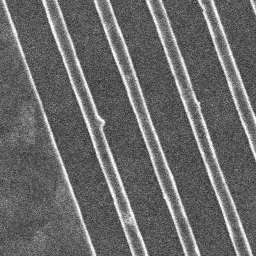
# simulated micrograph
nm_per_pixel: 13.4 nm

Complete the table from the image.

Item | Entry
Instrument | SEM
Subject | parallel lines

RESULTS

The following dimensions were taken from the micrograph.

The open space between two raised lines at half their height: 482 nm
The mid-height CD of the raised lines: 0.171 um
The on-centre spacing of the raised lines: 658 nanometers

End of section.